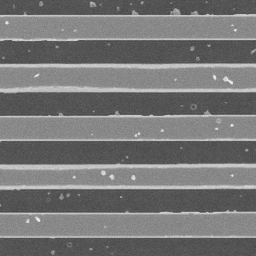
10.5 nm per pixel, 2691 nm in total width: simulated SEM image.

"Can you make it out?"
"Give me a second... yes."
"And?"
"lines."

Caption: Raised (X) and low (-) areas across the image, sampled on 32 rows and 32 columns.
--------------------------------
--------------------------------
XXXXXXXXXXXXXXXXXXXXXXXXXXXXXXXX
XXXXXXXXXXXXXXXXXXXXXXXXXXXXXXXX
XXXXXXXXXXXXXXXXXXXXXXXXXXXXXXXX
--------------------------------
--------------------------------
--------------------------------
XXXXXXXXXXXXXXXXXXXXXXXXXXXXXXXX
XXXXXXXXXXXXXXXXXXXXXXXXXXXXXXXX
XXXXXXXXXXXXXXXXXXXXXXXXXXXXXXXX
--------------------------------
--------------------------------
--------------------------------
-------------XXXXXX-XXXXXXXXXXXX
XXXXXXXXXXXXXXXXXXXXXXXXXXXXXXXX
XXXXXXXXXXXXXXXXXXXXXXXXXXXXXXXX
XXXXXXXXXXXXXXXXXXXXXXXXXXXXXXXX
--------------------------------
--------------------------------
--------------------------------
XXXXXXXXXXXXXXXXXXXXXXXXXXXXXXXX
XXXXXXXXXXXXXXXXXXXXXXXXXXXXXXXX
--------------------------------
--------------------------------
--------------------------------
--------------------------------
XXXXXXXXXXXXXXXXXXXXXXXXXXXXXXXX
XXXXXXXXXXXXXXXXXXXXXXXXXXXXXXXX
XXXXXXXXXXXXXXXXXXXXXXXXXXXXXXXX
--------------------------------
--------------------------------